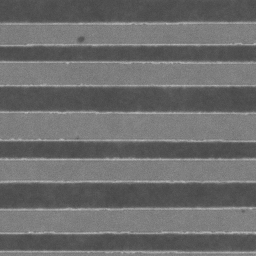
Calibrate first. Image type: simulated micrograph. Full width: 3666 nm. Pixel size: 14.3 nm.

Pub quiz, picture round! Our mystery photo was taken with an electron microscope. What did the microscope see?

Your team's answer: lines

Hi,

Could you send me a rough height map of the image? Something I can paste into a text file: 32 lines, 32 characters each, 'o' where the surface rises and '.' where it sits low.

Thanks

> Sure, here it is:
oooooooooooooooooooooooooooooooo
oooooooooooooooooooooooooooooooo
oooooooooooooooooooooooooooooooo
................................
................................
................................
oooooooooooooooooooooooooooooooo
oooooooooooooooooooooooooooooooo
................................
................................
................................
oooooooooooooooooooooooooooooooo
oooooooooooooooooooooooooooooooo
oooooooooooooooooooooooooooooooo
................................
................................
................................
................................
oooooooooooooooooooooooooooooooo
oooooooooooooooooooooooooooooooo
................................
................................
................................
oooooooooooooooooooooooooooooooo
oooooooooooooooooooooooooooooooo
oooooooooooooooooooooooooooooooo
................................
................................
................................
oooooooooooooooooooooooooooooooo
oooooooooooooooooooooooooooooooo
......................oooooooooo